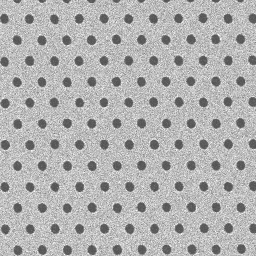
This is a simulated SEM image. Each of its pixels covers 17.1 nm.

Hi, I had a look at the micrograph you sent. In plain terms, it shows a regular array of holes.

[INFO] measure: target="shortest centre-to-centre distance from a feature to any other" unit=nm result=413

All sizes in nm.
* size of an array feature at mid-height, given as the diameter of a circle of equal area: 167